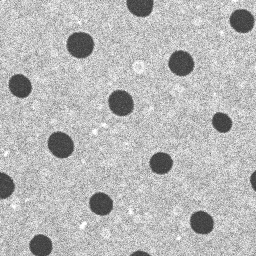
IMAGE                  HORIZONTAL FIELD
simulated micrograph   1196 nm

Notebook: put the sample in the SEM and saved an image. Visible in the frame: a regular array of holes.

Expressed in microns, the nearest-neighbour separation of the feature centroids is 0.335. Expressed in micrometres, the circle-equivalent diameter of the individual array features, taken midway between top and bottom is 0.114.